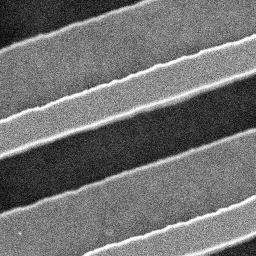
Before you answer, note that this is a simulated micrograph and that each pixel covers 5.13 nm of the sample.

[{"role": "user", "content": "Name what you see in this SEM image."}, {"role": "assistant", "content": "lines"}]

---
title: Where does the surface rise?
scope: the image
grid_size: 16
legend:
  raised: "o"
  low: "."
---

........oooooooo
.....ooooooooooo
..oooooooooooooo
oooooooooooooooo
oooooooooooooooo
ooooooooooooo...
oooooooooo......
ooooooo.........
oooo...........o
o...........oooo
.........ooooooo
......oooooooooo
...ooooooooooooo
oooooooooooooooo
oooooooooooooooo
oooooooooooooo..